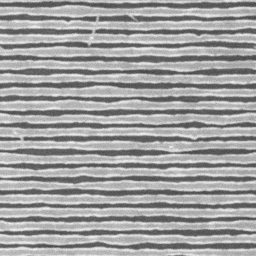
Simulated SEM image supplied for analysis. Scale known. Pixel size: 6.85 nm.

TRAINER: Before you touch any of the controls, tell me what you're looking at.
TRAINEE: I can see parallel lines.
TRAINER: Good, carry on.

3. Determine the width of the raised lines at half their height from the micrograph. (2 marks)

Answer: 44.5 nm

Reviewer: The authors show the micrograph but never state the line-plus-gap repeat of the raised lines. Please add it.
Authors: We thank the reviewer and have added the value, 91.8 nm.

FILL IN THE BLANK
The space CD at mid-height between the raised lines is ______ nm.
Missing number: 44.5